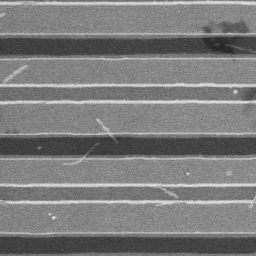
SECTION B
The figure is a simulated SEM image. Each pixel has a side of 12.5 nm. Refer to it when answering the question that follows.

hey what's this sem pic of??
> lines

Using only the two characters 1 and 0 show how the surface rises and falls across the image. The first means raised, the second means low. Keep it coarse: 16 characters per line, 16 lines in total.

1111111111111111
1111111111111111
0000000000000000
0000000000000000
1111111111111111
1111111111111111
1111111111111111
1111111111111111
0000000000000000
0000000000000000
1111111111111111
1111111111111111
1111111111111111
1111111111111111
1111111111111111
0000000000000000